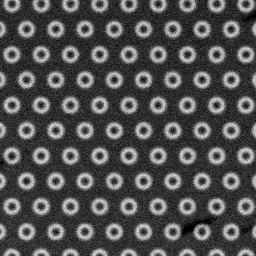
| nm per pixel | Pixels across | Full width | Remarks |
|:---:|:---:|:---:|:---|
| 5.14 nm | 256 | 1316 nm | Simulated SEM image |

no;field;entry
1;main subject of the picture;an array of small figures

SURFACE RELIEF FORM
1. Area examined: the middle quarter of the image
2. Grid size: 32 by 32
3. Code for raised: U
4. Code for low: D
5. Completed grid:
DDDDDDDDDDDDDDDDDDDDDDDDDDDDDDDD
DDDDDDDDDDDDDDDDDDDDDDDDDDDDDDDD
DDDDUUDDDDDUUUDDDDDUUDDDDDUUDDDD
DDDUUUUDDDDUUUDDDDUUUUDDDUUUUDDD
DDDUUUUDDDDUUUDDDDUUUUDDDUUUUDDD
DDDDUUUDDDDUUUDDDDDUUDDDDDUUDDDD
DDDDDDDDDDDDDDDDDDDDDDDDDDDDDDDD
DDDDDDDDDDDDDDDDDDDDDDDDDDDDDDDD
DUDDDDDDUUDDDDDUUDDDDDDUDDDDDDUU
UUUDDDDUUUUDDDUUUUDDDDUUUDDDDUUU
UUUUDDDUUUUDDDUUUUDDDDUUUDDDDUUU
UUUDDDDUUUDDDDDUUUDDDDUUUDDDDUUU
DDDDDDDDDDDDDDDDDDDDDDDDDDDDDDDD
DDDDDDDDDDDDDDDDDDDDDDDDDDDDDDDD
DDDDDDDDDDDDDDDDDDDDDDDDDDDDDDDD
DDDDUUUDDDDUUUDDDDUUUDDDDDUUUDDD
DDDUUUUDDDDUUUDDDDUUUUDDDUUUUDDD
DDDUUUUDDDDUUUDDDDUUUUDDDUUUUDDD
DDDDUUDDDDDDUDDDDDDUUDDDDDUUDDDD
DDDDDDDDDDDDDDDDDDDDDDDDDDDDDDDD
DDDDDDDDDDDDDDDDDDDDDDDDDDDDDDDD
UUUDDDDDUUDDDDDUUUDDDDUUUDDDDDUU
UUUDDDDUUUUDDDUUUUDDDDUUUDDDDUUU
UUUDDDDUUUUDDDUUUUDDDDUUUDDDDUUU
UUUDDDDDUUDDDDDUUDDDDDUUUDDDDDUU
DDDDDDDDDDDDDDDDDDDDDDDDDDDDDDDD
DDDDDDDDDDDDDDDDDDDDDDDDDDDDDDDD
DDDDUUDDDDDDUDDDDDDUUDDDDDUUDDDD
DDDUUUUDDDDUUUDDDDUUUUDDDUUUUDDD
DDDUUUUDDDDUUUDDDDUUUUDDDUUUUDDD
DDDDUUUDDDDUUUDDDDUUUDDDDDUUUDDD
DDDDDDDDDDDDDDDDDDDDDDDDDDDDDDDD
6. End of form